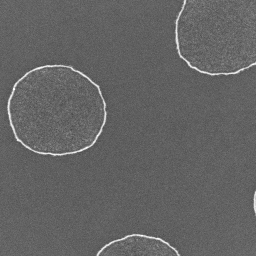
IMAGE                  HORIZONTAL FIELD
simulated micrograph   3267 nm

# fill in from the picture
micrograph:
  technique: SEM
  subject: raised bodies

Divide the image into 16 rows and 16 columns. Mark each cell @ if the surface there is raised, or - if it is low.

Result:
-----------@@@@@
-----------@@@@@
-----------@@@@@
-----------@@@@@
--@@@--------@@-
-@@@@@----------
-@@@@@@---------
-@@@@@@---------
-@@@@@----------
--@@@-----------
----------------
----------------
----------------
----------------
----------------
------@@@@@-----